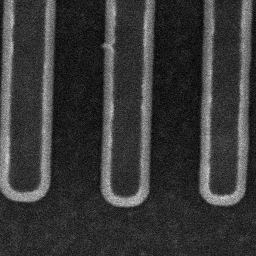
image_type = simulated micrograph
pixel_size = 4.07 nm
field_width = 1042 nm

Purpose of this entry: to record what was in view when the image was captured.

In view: one or a few lines or trenches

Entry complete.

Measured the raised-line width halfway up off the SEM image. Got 172 nanometres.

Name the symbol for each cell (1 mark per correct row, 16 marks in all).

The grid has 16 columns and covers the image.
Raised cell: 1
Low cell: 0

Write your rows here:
1110000110000111
1110000110000111
1110000110000110
1110000110000110
1110000110000110
1110000110000110
1110000110000110
1110000110000110
1110000110000110
1110000110000110
1110000110000110
1110000110000110
0000000110000110
0000000000000000
0000000000000000
0000000000000000